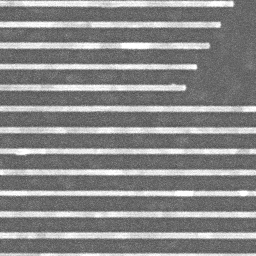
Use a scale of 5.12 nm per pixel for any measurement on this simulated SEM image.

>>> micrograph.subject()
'parallel lines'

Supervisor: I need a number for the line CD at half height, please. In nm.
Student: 25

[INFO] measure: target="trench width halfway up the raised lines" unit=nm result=84.6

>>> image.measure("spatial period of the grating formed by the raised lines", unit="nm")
108